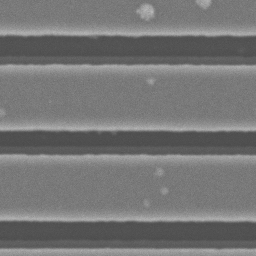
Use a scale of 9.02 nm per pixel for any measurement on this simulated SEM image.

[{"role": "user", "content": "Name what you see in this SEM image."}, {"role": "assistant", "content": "lines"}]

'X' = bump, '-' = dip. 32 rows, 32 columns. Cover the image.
XXXXXXXXXXXXXXXXXXXXXXXXXXXXXXXX
XXXXXXXXXXXXXXXXXXXXXXXXXXXXXXXX
XXXXXXXXXXXXXXXXXXXXXXXXXXXXXXXX
XXXXXXXXXXXXXXXXXXXXXXXXXXXXXXXX
---X------------XX-------XX--XX-
--------------------------------
--------------------------------
--------------------------------
XXXXXXXXXXXXXXXXXXXXXXXXXXXXXXXX
XXXXXXXXXXXXXXXXXXXXXXXXXXXXXXXX
XXXXXXXXXXXXXXXXXXXXXXXXXXXXXXXX
XXXXXXXXXXXXXXXXXXXXXXXXXXXXXXXX
XXXXXXXXXXXXXXXXXXXXXXXXXXXXXXXX
XXXXXXXXXXXXXXXXXXXXXXXXXXXXXXXX
XXXXXXXXXXXXXXXXXXXXXXXXXXXXXXXX
XXXXXXXXXXXXXXXXXXXXXXXXXXXXXXXX
--------------------------------
--------------------------------
--------------------------------
XXXXXXXXXXXXXXXXXXXXXXXXXXXXXXXX
XXXXXXXXXXXXXXXXXXXXXXXXXXXXXXXX
XXXXXXXXXXXXXXXXXXXXXXXXXXXXXXXX
XXXXXXXXXXXXXXXXXXXXXXXXXXXXXXXX
XXXXXXXXXXXXXXXXXXXXXXXXXXXXXXXX
XXXXXXXXXXXXXXXXXXXXXXXXXXXXXXXX
XXXXXXXXXXXXXXXXXXXXXXXXXXXXXXXX
XXXXXXXXXXXXXXXXXXXXXXXXXXXXXXXX
XXXXXXXXXXXXXXXXXXXXXXXXXXXXXXXX
--------------------------------
--------------------------------
--------------------------------
XXXXXXXXXXXXXXXXXXXXXXXXXXXXXXXX